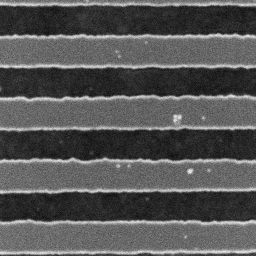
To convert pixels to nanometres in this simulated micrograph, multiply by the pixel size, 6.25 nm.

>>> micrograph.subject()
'lines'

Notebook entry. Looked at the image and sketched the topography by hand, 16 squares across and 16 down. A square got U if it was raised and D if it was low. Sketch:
DDDDDDDDDDDDDDDD
DDDDDDDDDDDDDDDD
UUUUUUUUUUUUUUUU
UUUUUUUUUUUUUUUU
DDDDDDDDDDDDDDDD
DDDDDDDDDDDDDDDD
UUUUUUUUUUUUUUUU
UUUUUUUUUUUUUUUU
DDDDDDDDDDDDDDDD
DDDDDDDDDDDDDDDD
UUUUUUUUUUUUUUUU
UUUUUUUUUUUUUUUU
DDDDDDDDDDDDDDDD
DDDDDDDDDDDDDDDD
UUUUUUUUUUUUUUUU
UUUUUUUUUUUUUUUU